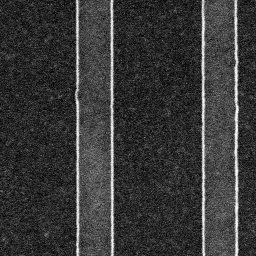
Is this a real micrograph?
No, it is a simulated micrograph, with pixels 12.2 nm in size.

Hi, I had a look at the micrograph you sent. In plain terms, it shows one or a few lines or trenches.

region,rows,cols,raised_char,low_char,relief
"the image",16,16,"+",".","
+++++..++++++..+
+++++..++++++..+
+++++..++++++..+
+++++..++++++..+
+++++..++++++..+
+++++..++++++..+
+++++..++++++..+
+++++..++++++..+
+++++..++++++..+
+++++..++++++..+
+++++..++++++..+
+++++..++++++..+
+++++..++++++..+
+++++..++++++..+
+++++..++++++..+
+++++..++++++..+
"